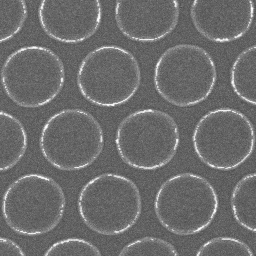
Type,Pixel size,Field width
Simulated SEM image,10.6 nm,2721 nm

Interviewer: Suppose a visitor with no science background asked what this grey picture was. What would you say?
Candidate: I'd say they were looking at a regular array of raised bodies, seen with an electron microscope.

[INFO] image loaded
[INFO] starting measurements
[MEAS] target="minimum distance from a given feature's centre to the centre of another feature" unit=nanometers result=791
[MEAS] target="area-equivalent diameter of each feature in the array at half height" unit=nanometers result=624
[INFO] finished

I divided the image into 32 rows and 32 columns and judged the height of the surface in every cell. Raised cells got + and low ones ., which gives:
+++..+++++++...+++++++..++++++++
+++..++++++++..+++++++..++++++++
+++..++++++++..+++++++..+++++++.
+++..+++++++...+++++++...++++++.
++....+++++.....+++++.....++++..
................................
..++++.....+++++.....+++++....++
.++++++...+++++++...++++++....++
++++++++..+++++++..++++++++..+++
++++++++..+++++++..++++++++..+++
++++++++..+++++++..++++++++..+++
.++++++...+++++++...++++++....++
..++++.....+++++.....++++......+
................................
+......++++.....+++++.....++++..
+++...++++++...+++++++...++++++.
+++..++++++++..+++++++..++++++++
+++..++++++++..+++++++..++++++++
+++..++++++++..+++++++..++++++++
+++...++++++...+++++++...++++++.
++.....++++.....+++++.....++++..
................................
..++++......++++.....+++++....++
.++++++...+++++++...+++++++..+++
.+++++++..+++++++...+++++++..+++
++++++++..+++++++..++++++++..+++
++++++++..+++++++...+++++++..+++
.++++++....++++++...++++++....++
..++++.....+++++.....++++......+
................................
++.....++++.....+++++.....+++++.
+++...++++++...+++++++...++++++.